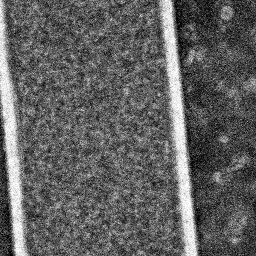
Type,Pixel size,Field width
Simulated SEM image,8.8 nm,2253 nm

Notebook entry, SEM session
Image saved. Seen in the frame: one or a few lines or trenches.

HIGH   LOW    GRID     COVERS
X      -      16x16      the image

XXXXXXXXXX------
XXXXXXXXXX------
XXXXXXXXXXX-----
XXXXXXXXXXX-----
XXXXXXXXXXX-----
XXXXXXXXXXX-----
-XXXXXXXXXX-----
-XXXXXXXXXX-----
-XXXXXXXXXX-----
-XXXXXXXXXX-----
-XXXXXXXXXX-----
-XXXXXXXXXXX----
-XXXXXXXXXXX----
-XXXXXXXXXXX----
-XXXXXXXXXXX----
-XXXXXXXXXXX----